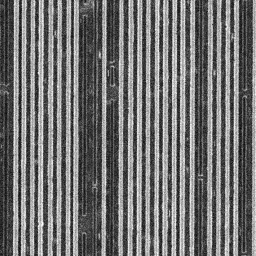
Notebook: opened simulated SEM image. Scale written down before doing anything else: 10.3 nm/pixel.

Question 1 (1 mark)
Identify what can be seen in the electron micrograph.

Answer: parallel lines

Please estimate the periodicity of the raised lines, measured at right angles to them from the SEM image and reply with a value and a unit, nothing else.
90.7 nanometers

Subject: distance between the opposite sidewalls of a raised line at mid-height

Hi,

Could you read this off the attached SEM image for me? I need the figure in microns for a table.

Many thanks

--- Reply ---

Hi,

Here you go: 0.0372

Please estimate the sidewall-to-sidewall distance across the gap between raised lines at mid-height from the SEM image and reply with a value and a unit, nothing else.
55.2 nm